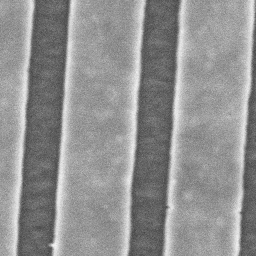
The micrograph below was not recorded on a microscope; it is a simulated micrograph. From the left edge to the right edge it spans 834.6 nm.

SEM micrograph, one or a few lines or trenches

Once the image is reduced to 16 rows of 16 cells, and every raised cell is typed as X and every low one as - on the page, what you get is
XX--XXXXX--XXXXX
XX--XXXXX--XXXXX
XX--XXXXX--XXXXX
XX--XXXXX--XXXXX
XX--XXXXX--XXXXX
XX--XXXXX--XXXXX
XX--XXXXX--XXXX-
XX--XXXXX--XXXX-
XX--XXXX---XXXX-
X---XXXX---XXXX-
X---XXXX---XXXX-
X---XXXX---XXXX-
X---XXXX---XXXX-
X---XXXX--XXXXX-
X--XXXXX--XXXXX-
X--XXXXX--XXXXX-